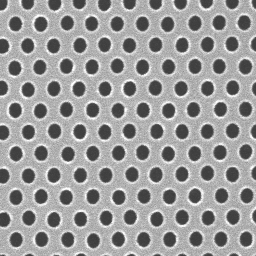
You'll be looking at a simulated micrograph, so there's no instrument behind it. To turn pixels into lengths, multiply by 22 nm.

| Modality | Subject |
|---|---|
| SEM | a regular array of holes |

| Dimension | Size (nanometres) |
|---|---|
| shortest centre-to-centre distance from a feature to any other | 537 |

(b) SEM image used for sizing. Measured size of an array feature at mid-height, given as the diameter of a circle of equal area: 0.322 µm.